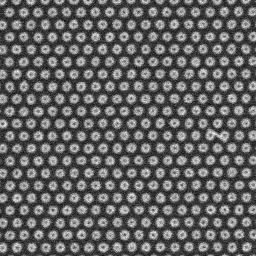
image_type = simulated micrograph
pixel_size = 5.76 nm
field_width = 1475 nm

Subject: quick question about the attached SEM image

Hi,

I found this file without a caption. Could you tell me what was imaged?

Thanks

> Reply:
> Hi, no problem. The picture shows a regular array of ring-shaped raised bodies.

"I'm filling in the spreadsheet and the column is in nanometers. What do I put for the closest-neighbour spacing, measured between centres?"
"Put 79.4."